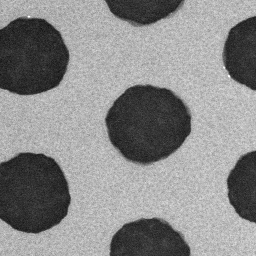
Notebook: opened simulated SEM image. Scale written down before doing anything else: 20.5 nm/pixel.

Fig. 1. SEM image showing holes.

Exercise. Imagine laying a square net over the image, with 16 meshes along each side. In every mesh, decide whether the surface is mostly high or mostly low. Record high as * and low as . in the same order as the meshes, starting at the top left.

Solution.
*******....*****
*..*****.******.
....**********..
....**********..
....**********..
...*****..******
*******....*****
*******.....****
*******.....****
********...*****
....***********.
....**********..
....**********..
....***********.
**.****....*****
*******.....****